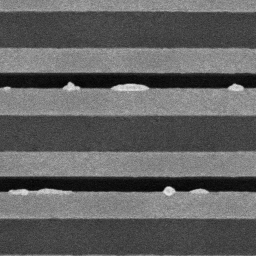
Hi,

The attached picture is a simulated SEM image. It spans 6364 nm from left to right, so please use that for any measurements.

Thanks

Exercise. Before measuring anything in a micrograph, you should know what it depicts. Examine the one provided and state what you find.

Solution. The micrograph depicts lines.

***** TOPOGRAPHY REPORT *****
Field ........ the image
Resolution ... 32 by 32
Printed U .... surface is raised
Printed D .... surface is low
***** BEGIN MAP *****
UUUUUUUUUUUUUUUUUUUUUUUUUUUUUUUU
DDDDDDDDDDDDDDDDDDDDDDDDDDDDDDDD
DDDDDDDDDDDDDDDDDDDDDDDDDDDDDDDD
DDDDDDDDDDDDDDDDDDDDDDDDDDDDDDDD
DDDDDDDDDDDDDDDDDDDDDDDDDDDDDDDD
DDDDDDDDDDDDDDDDDDDDDDDDDDDDDDDD
UUUUUUUUUUUUUUUUUUUUUUUUUUUUUUUU
UUUUUUUUUUUUUUUUUUUUUUUUUUUUUUUU
UUUUUUUUUUUUUUUUUUUUUUUUUUUUUUUU
DDDDDDDDDDDDDDDDDDDDDDDDDDDDDDDD
DDDDDDDDUDDDDDDDDDDDDDDDDDDDDDDD
UUUUUUUUUUUUUUUUUUUUUUUUUUUUUUUU
UUUUUUUUUUUUUUUUUUUUUUUUUUUUUUUU
UUUUUUUUUUUUUUUUUUUUUUUUUUUUUUUU
DDDDDDDDDDDDDDDDDDDDDDDDDDDDDDDD
DDDDDDDDDDDDDDDDDDDDDDDDDDDDDDDD
DDDDDDDDDDDDDDDDDDDDDDDDDDDDDDDD
DDDDDDDDDDDDDDDDDDDDDDDDDDDDDDDD
DDDDDDDDDDDDDDDDDDDDDDDDDDDDDDDD
UUUUUUUUUUUUUUUUUUUUUUUUUUUUUUUU
UUUUUUUUUUUUUUUUUUUUUUUUUUUUUUUU
UUUUUUUUUUUUUUUUUUUUUUUUUUUUUUUU
DDDDDDDDDDDDDDDDDDDDDDDDDDDDDDDD
DDDDDDDDDDDDDDDDDDDDDDDDDDDDDDDD
UUUUUUUUUUUUUUUUUUUUUUUUUUUUUUUU
UUUUUUUUUUUUUUUUUUUUUUUUUUUUUUUU
UUUUUUUUUUUUUUUUUUUUUUUUUUUUUUUU
DDDDDDDDDDDDDDDDDDDDDDDDDDDDDDDD
DDDDDDDDDDDDDDDDDDDDDDDDDDDDDDDD
DDDDDDDDDDDDDDDDDDDDDDDDDDDDDDDD
DDDDDDDDDDDDDDDDDDDDDDDDDDDDDDDD
DDDDDDDDDDDDDDDDDDDDDDDDDDDDDDDD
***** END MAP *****